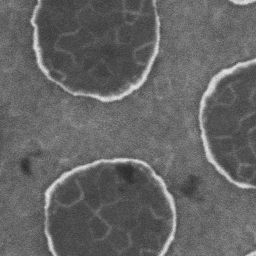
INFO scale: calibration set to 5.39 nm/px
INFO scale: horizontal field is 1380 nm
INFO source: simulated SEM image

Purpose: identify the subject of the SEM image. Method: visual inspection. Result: raised bodies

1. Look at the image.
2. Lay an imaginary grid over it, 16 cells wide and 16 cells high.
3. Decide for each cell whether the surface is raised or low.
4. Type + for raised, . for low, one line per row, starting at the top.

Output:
..++++++++......
..++++++++......
..++++++++......
..++++++++......
...++++++.....++
....++++.....+++
.............+++
.............+++
.............+++
.............+++
.....++++.....++
...+++++++.....+
...++++++++.....
...++++++++.....
...++++++++.....
...+++++++......